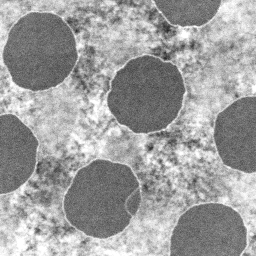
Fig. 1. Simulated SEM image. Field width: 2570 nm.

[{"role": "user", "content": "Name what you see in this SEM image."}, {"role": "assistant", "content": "raised bodies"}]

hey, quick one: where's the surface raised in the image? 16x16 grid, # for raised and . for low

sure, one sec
..........####..
.###.......##...
#####...........
#####....#......
.###...####.....
.##....#####....
.......####...##
#......####..###
##...........###
##............##
##...###......##
#...#####.......
....####........
....####...####.
.....###...####.
...........####.